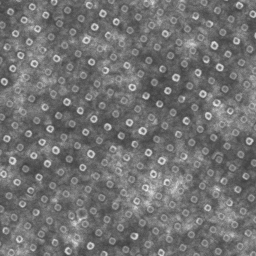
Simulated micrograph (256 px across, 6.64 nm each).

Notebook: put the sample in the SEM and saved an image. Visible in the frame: a regular array of raised bodies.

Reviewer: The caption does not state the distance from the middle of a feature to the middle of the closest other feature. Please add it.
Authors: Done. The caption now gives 70.7 nm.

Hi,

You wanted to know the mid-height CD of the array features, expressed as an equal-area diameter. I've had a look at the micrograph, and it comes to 0.0437 um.